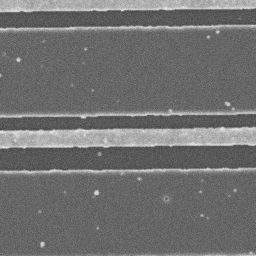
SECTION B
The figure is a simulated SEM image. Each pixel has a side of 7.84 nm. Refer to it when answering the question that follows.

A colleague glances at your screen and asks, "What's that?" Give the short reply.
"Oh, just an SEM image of lines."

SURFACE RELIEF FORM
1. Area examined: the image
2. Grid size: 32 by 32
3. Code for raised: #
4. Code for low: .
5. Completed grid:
################################
................................
................................
........########################
################################
################################
################################
################################
################################
################################
################################
################################
################################
################################
#############...#...............
................................
.........##########.############
################################
................................
................................
................................
################################
################################
################################
################################
################################
################################
################################
################################
################################
################################
################################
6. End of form